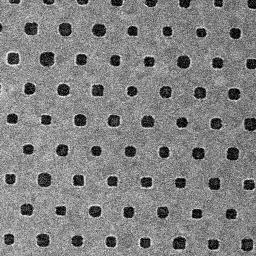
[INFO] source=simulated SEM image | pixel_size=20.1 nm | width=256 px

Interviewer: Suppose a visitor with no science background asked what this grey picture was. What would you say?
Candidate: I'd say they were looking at a regular array of holes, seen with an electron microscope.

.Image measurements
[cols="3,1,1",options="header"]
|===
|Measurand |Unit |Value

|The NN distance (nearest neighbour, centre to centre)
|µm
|0.684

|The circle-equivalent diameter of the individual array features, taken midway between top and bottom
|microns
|0.259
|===